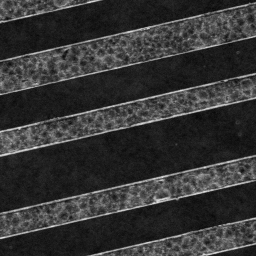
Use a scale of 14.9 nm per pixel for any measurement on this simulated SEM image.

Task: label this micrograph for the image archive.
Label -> one or a few lines or trenches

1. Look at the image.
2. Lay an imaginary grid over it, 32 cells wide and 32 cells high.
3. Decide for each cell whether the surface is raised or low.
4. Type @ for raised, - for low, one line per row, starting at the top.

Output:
@@@@@@@@@@---------------------@
@@@@@@---------------------@@@@@
@----------------------@@@@@@@@@
------------------@@@@@@@@@@@@@@
--------------@@@@@@@@@@@@@@@@@@
---------@@@@@@@@@@@@@@@@@@@----
-----@@@-@@@@@@@@@@@@@@---------
-@@@@@@@@@@@@@@@@@@-------------
@@@@@@@@@@@@@@@-----------------
@@@@@@@@@@---------------------@
@@@@-@---------------------@@@@@
@---------------------@@@@@@@@@@
------------------@@@@@@@@@@-@@-
-------------@@@@@@@@@@@@@------
---------@@@@@@@@@@@@@----------
----@@@@@@@@@@@@@---------------
@@@@@@@@@@@@@-------------------
@@@@@@@@@-----------------------
@@@@----------------------------
--------------------------------
----------------------------@@@@
------------------------@@@@@@@@
--------------------@@@@@@@@@@@@
--------------@@@@@@@@@@@@@-----
----------@@@@@@@@@@@@@---------
-----@@@@@@@@@@@@@@-------------
-@@@@@@@@@@@@@------------------
@@@@@@@@@@---------------------@
@@@@@@--------------------@@@@@@
@---------------------@@@@@@@@@@
------------------@@@@@@@@@@@@@@
--------------@@@@@@@@@@@@@-----